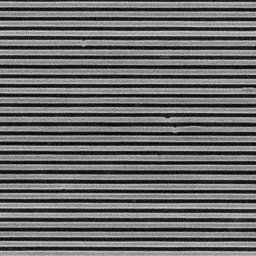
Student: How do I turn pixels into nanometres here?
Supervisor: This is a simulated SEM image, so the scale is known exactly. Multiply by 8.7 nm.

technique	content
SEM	parallel lines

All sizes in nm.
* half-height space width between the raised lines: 44.6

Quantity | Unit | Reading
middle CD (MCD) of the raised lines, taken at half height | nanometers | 44.6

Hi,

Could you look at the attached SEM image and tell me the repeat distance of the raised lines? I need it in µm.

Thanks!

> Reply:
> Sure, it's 0.0834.